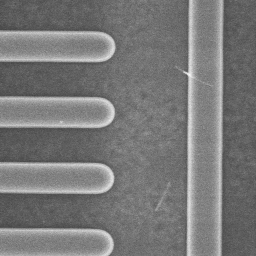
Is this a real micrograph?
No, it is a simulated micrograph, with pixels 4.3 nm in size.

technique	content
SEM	groups of lines, slits or small figures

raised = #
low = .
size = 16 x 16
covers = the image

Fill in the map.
............##..
............##..
#######.....##..
#######.....##..
............##..
............##..
#######.....##..
#######.....##..
............##..
............##..
#######.....##..
#######.....##..
............##..
............##..
######......##..
#######.....##..